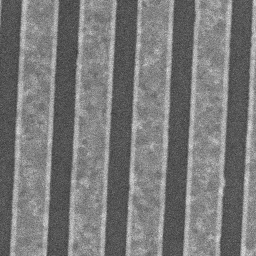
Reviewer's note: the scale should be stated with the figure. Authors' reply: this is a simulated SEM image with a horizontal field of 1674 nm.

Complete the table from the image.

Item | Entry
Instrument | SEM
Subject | parallel lines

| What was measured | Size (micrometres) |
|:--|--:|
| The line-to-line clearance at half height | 0.165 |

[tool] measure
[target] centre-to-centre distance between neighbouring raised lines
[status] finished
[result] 377 nm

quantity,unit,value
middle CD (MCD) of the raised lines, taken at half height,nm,210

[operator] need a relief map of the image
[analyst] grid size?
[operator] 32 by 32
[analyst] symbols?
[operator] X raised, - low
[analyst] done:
---XXXX---XXXX---XXXX----XXXX---
---XXXX---XXXX---XXXX----XXXX---
---XXXX---XXXX---XXXX----XXXX---
---XXXX---XXXX---XXXX----XXXX---
---XXXX---XXXX---XXXX----XXXX---
---XXXX---XXXX---XXXX----XXX----
---XXXX---XXXX---XXXX---XXXX----
---XXXX---XXXX---XXXX---XXXX----
---XXXX---XXXX---XXXX---XXXX----
---XXXX---XXXX---XXXX---XXXX----
---XXXX---XXXX---XXXX---XXXX---X
---XXX----XXXX---XXXX---XXXX---X
--XXXX----XXXX---XXXX---XXXX---X
--XXXX----XXXX---XXXX---XXXX---X
--XXXX----XXXX---XXXX---XXXX---X
--XXXX----XXX----XXXX---XXXX---X
--XXXX---XXXX----XXXX---XXXX---X
--XXXX---XXXX----XXXX---XXXX---X
--XXXX---XXXX----XXXX---XXXX---X
--XXXX---XXXX----XXXX---XXXX---X
--XXXX---XXXX----XXXX---XXXX---X
--XXXX---XXXX----XXX----XXXX---X
--XXXX---XXXX----XXX----XXXX---X
--XXXX---XXXX---XXXX----XXXX---X
--XXXX---XXXX---XXXX----XXXX---X
--XXXX---XXXX---XXXX----XXX----X
--XXXX---XXXX---XXXX----XXX----X
--XXXX---XXXX---XXXX---XXXX----X
--XXXX---XXXX---XXXX---XXXX---XX
--XXXX---XXXX---XXXX---XXXX---XX
--XXXX---XXXX---XXXX---XXXX----X
--XXXX---XXXX---XXXX---XXXX---XX